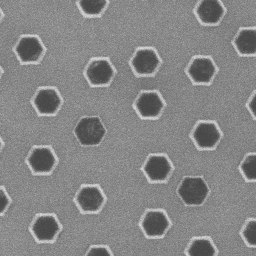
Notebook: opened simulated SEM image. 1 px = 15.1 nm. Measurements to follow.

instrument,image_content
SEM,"a regular array of raised bodies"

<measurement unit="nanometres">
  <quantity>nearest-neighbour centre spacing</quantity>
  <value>832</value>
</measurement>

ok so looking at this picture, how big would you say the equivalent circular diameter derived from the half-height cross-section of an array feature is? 438 nm